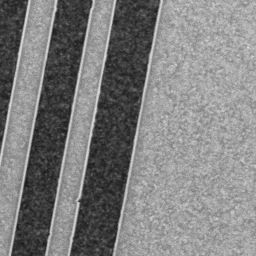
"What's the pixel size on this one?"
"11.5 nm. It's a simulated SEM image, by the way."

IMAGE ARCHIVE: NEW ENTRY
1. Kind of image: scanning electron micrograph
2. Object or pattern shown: one or a few lines or trenches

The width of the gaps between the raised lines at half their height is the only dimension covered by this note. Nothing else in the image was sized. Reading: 40.9 pixels